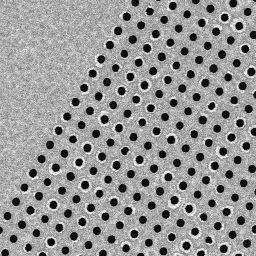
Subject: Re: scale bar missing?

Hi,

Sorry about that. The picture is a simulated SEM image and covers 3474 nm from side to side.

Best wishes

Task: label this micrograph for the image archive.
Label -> a regular array of holes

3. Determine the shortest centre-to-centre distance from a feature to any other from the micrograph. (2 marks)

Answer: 224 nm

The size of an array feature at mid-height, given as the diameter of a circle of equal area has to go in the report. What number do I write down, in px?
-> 8.06